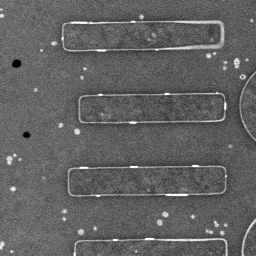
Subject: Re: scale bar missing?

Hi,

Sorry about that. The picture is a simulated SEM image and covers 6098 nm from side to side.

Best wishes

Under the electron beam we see groups of lines, slits or small figures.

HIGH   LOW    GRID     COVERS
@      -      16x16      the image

----------------
----@@@@@@@@@@--
----@@@@@@@@@@--
----------------
----------------
---------------@
-----@@@@@@@@@-@
-----@@@@@@@@@-@
----------------
----------------
------@@@@@@@@--
----@@@@@@@@@@--
----------------
----------------
---------------@
-----@@@@@@@@@-@